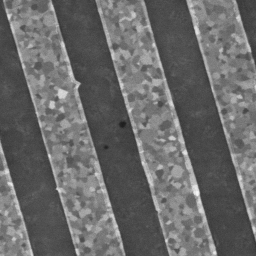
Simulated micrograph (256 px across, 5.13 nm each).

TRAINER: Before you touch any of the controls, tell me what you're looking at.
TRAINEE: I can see one or a few lines or trenches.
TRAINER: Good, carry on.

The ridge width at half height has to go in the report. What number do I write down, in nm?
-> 232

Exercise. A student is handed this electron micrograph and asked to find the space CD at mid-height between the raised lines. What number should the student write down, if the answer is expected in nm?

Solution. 219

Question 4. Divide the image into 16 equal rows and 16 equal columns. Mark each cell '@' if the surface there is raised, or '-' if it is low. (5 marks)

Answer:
@@@---@@@---@@@-
-@@@--@@@---@@@-
-@@@---@@@--@@@-
-@@@---@@@---@@@
--@@---@@@---@@@
--@@@---@@---@@@
--@@@---@@@---@@
--@@@---@@@---@@
---@@@--@@@---@@
---@@@---@@@--@@
---@@@---@@@---@
@---@@@--@@@---@
@---@@@---@@@--@
@---@@@---@@@---
@@--@@@---@@@---
@@---@@@---@@---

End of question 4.